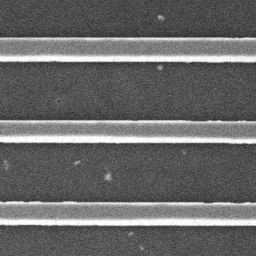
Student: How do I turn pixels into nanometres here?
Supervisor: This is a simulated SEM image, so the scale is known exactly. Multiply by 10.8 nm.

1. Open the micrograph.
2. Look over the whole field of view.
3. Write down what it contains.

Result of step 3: lines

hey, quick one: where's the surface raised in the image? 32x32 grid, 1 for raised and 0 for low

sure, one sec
00000000000000000000000000000000
00000000000000000000000000000000
00000000000000000000000000000000
00000000000000000000000000000000
00000000000000000000000000000000
11111111111111111111111111111111
11111111111111111111111111111111
00000000000000000000000000000000
00000000000000000000000000000000
00000000000000000000000000000000
00000000000000000000000000000000
00000000000000000000000000000000
00000000000000000000000000000000
00000000000000000000000000000000
00000000000000000000000000000000
11111111111111111111111111111111
11111111111111111111111111111111
00000000000000111111111111111111
00000000000000000000000000000000
00000000000000000000000000000000
00000000000000000000000000000000
00000000000000000000000000000000
00000000000000000000000000000000
00000000000000000000000000000000
00000000000000000000000000000000
11111111111111111111111111111111
11111111111111111111111111111111
11111111111111111111111111111111
00000000000000000000000000000000
00000000000000000000000000000000
00000000000000000000000000000000
00000000000000000000000000000000